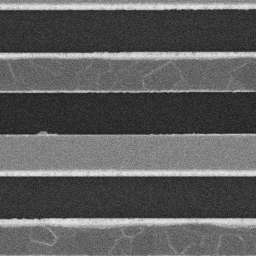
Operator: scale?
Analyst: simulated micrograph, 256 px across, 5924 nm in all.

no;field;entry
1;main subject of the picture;lines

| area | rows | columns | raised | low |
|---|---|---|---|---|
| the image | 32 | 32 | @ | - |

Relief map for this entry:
@@@@@@@@@@@@@@@@@@@@@@@@@@@@@@@@
--------------------------------
--------------------------------
--------------------------------
--------------------------------
--------------------------------
--------------------------------
@@@@@@@@@@@@@@@@@@@@@@@@@@@@@@@@
@@@@@@@@@@@@@@@@@@@@@@@@@@@@@@@@
@@@@@@@@@@@@@@@@@@@@@@@@@@@@@@@@
@@@@@@@@@@@@@@@@@@@@@@@@@@@@@@@@
@@@@@@@@@@@@@@@@@@@@-@@------@--
--------------------------------
--------------------------------
--------------------------------
--------------------------------
--------------------------------
@@@@@@@@@@@@@@@@@@@@@@@@@@@@@@@@
@@@@@@@@@@@@@@@@@@@@@@@@@@@@@@@@
@@@@@@@@@@@@@@@@@@@@@@@@@@@@@@@@
@@@@@@@@@@@@@@@@@@@@@@@@@@@@@@@@
@@@@@@@@@@@@@@@@@@@@@@@@@@@@@@@@
--------------------------------
--------------------------------
--------------------------------
--------------------------------
--------------------------------
---------------@@@@@@@@@@@@@@@-@
@@@@@@@@@@@@@@@@@@@@@@@@@@@@@@@@
@@@@@@@@@@@@@@@@@@@@@@@@@@@@@@@@
@@@@@@@@@@@@@@@@@@@@@@@@@@@@@@@@
@@@@@@@@@@@@@@@@@@@@@@@@@@@@@@@@